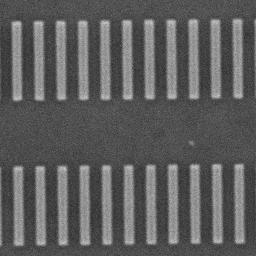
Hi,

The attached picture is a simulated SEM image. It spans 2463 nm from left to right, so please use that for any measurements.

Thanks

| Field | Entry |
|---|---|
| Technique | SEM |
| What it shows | groups of lines, slits or small figures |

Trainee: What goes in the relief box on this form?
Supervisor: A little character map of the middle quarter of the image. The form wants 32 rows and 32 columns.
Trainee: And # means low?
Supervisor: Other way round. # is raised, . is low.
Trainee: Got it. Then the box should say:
....##...##....##...##....##....
....##...##....##...##....##....
....##...##....##...##....##....
....##...##....##...##....##....
....##...##....##...##....##....
....##...##....##...##....##....
....##...##....##...##....##....
....##...##....##...##....##....
....##...##....##...##....##....
................................
................................
................................
................................
................................
................................
................................
................................
................................
................................
................................
................................
................................
................................
................................
................................
..........................##....
#...##....#....##....##...##....
#...##....#....##....##...##....
#...##....#....##....##...##....
#...##....##...##....##...##....
#...##....##...##....##...##....
#...##....##...##....##...##....